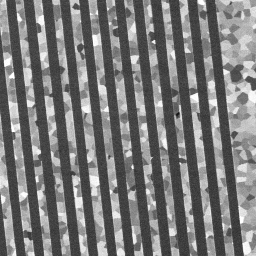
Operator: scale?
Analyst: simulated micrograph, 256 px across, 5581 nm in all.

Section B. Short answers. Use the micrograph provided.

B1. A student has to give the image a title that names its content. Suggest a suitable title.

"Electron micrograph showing parallel lines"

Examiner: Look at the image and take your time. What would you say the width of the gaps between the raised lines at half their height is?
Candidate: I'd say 0.225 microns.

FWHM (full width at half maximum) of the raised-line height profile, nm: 165